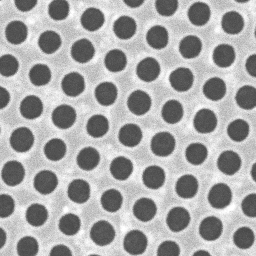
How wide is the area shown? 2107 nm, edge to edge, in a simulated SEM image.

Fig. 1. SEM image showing a regular array of holes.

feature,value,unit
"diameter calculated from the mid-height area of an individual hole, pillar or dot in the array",0.202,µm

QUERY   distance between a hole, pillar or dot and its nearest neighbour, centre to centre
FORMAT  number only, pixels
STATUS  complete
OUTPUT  33.7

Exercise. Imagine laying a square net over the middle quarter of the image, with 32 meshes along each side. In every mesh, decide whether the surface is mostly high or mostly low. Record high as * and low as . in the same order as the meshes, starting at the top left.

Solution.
**********......**......********
***********....***......***.....
*...**************......**......
.....**************....***......
.....*****..********..****......
.....***.....**************.....
.....***.....*****.*********...*
....****.....***.....***********
********.....***......**********
*********....***......***....***
..********.*****......***.....**
...*************.....***......**
...**************...****......**
...***.....**************.....**
...***.....**************....***
..***......****....*************
*****......***.....*************
******....***.......***....*****
********.****.......**......****
**************.....***......****
.**************...****......***.
.***....**************......**..
***......*************.....***..
***......****...**************..
***......***.....**************.
****....***......****...********
*****..****......***.....*******
************.....***.....*****..
************....***......****...
**....**************.....***....
*.....**************.....***....
*......****..***************....